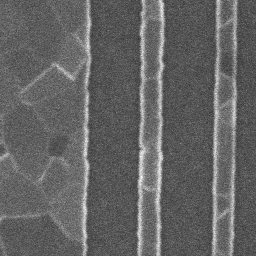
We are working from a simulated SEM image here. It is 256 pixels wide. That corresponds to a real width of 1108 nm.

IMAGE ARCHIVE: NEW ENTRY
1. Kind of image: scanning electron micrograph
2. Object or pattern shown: one or a few lines or trenches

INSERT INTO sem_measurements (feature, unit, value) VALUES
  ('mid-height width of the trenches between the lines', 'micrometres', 0.236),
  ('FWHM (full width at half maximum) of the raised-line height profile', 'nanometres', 80.1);